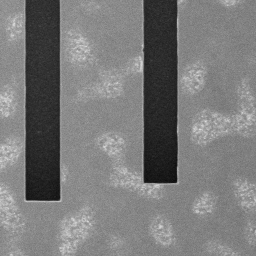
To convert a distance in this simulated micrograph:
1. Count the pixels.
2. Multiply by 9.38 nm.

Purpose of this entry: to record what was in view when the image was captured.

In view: one or a few lines or trenches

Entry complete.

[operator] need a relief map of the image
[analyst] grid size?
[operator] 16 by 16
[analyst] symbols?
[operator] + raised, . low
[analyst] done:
++..+++++..+++++
++..+++++..+++++
++..+++++..+++++
++..+++++..+++++
++..+++++..+++++
++..+++++..+++++
++..+++++..+++++
++..+++++..+++++
++..+++++..+++++
++..+++++..+++++
++..+++++..+++++
++..++++++++++++
++.+++++++++++++
++++++++++++++++
++++++++++++++++
++++++++++++++++